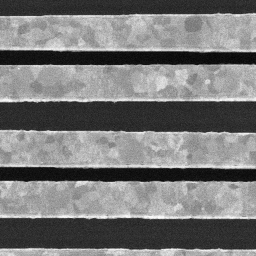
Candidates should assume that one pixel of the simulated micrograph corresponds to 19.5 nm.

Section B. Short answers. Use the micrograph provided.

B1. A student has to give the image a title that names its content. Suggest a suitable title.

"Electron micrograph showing lines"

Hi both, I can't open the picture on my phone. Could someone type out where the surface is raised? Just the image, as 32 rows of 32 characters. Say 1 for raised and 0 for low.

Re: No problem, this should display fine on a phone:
00000000000000000000000000000000
00000000000000000000000000000000
11111111111111111111111111111111
11111111111111111111111111111111
11111111111111111111111111111111
11111111111111111111111111111111
00000000000000000000000000000000
00000000000000000000000000000000
11111111111111111111111111111111
11111111111111111111111111111111
11111111111111111111111111111111
11111111111111111111111111111111
11111111111111111111111111111111
00000000000000000000000000000000
00000000000000000000000000000000
00000000000000000000000000000000
11111111111111110011000000000000
11111111111111111111111111111111
11111111111111111111111111111111
11111111111111111111111111111111
11111111111111111111111111111111
00000000000000000000000000000000
00000000000000000000000000000000
11111111111111111111111111111111
11111111111111111111111111111111
11111111111111111111111111111111
11111111111111111111111111111111
00000000000000000000000000000000
00000000000000000000000000000000
00000000000000000000000000000000
00000000000000000000000000000000
11111111111111111111111111111111